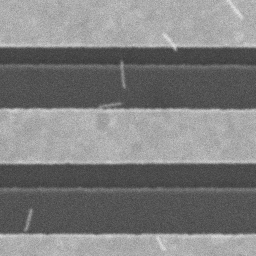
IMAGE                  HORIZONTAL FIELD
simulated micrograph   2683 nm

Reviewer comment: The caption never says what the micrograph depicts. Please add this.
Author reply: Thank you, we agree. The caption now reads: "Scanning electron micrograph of lines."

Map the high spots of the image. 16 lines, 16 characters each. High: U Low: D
UUUUUUUUUUUUUUUU
UUUUUUUUUUUUUUUU
UUUUUUUUUUUUUUUU
DDDDDDDDDDDDDDDD
DDDDDDDDDDDDDDDD
DDDDDDDDDDDDDDDD
DDDDDDDDDDDDDDDD
UUUUUUUUUUUUUUUU
UUUUUUUUUUUUUUUU
UUUUUUUUUUUUUUUU
DDDDDDDDDDDDDDDD
DDDDDDDDDDDDDDDD
DDDDDDDDDDDDDDDD
DDDDDDDDDDDDDDDD
DDDDDDDDDDDDDDDD
UUUUUUUUUUUUUUUU